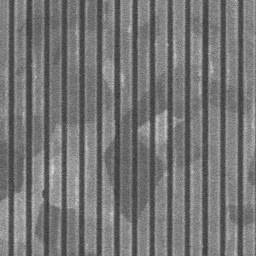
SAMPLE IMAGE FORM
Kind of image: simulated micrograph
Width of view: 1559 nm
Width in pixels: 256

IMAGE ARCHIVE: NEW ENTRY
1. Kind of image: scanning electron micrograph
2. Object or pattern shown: parallel lines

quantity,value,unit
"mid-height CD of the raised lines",67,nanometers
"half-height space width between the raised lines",44.2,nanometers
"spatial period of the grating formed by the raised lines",108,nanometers